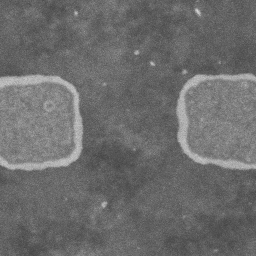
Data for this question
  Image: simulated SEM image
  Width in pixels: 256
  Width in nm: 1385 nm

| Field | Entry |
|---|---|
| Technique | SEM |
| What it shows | raised bodies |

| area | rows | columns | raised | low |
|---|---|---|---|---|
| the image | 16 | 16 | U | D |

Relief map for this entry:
DDDDDDDDDDDDDDDD
DDDDDDDDDDDDDDDD
DDDDDDDDDDDDDDDD
DDDDDDDDDDDDDDDD
DDDDDDDDDDDDDDDD
UUUUUDDDDDDDUUUU
UUUUUDDDDDDUUUUU
UUUUUDDDDDDUUUUU
UUUUUDDDDDDUUUUU
UUUUUDDDDDDDUUUU
DDDDDDDDDDDDDDDD
DDDDDDDDDDDDDDDD
DDDDDDDDDDDDDDDD
DDDDDDDDDDDDDDDD
DDDDDDDDDDDDDDDD
DDDDDDDDDDDDDDDD